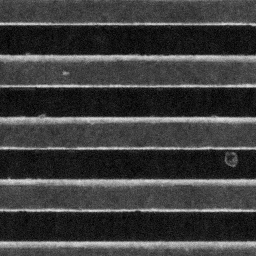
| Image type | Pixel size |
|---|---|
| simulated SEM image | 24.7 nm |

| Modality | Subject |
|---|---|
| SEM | lines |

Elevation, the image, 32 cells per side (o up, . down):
oooooooooooooooooooooooooooooooo
oooooooooooooooooooooooooooooooo
oooooooooooooooooooooooooooooooo
................................
................................
................................
................................
oooooooooooooooooooooooooooooooo
oooooooooooooooooooooooooooooooo
oooooooooooooooooooooooooooooooo
oooooooooooooooooooooooooooooooo
................................
................................
................................
................................
oooooooooooooooooooooooooooooooo
oooooooooooooooooooooooooooooooo
oooooooooooooooooooooooooooooooo
...ooo..oo.....ooo..o.ooo.ooo..o
................................
................................
................................
................................
oooooooooooooooooooooooooooooooo
oooooooooooooooooooooooooooooooo
oooooooooooooooooooooooooooooooo
................................
................................
................................
................................
................................
oooooooooooooooooooooooooooooooo